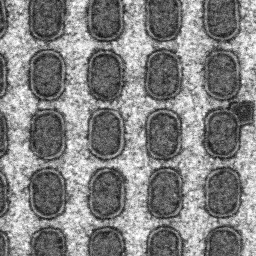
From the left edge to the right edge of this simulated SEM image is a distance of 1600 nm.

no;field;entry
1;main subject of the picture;a regular array of raised bodies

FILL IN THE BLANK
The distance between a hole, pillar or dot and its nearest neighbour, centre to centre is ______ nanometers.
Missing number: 360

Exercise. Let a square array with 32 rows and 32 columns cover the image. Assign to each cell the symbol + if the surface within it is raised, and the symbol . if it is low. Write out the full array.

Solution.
....++++...++++...++++....++++..
+...++++...++++...++++....++++..
+...++++...++++...++++....++++..
+...++++...++++...++++....++++..
.....++.....+++....+++.....++...
................................
....................+...........
....++++...++++....+++....+++...
+...++++...++++....+++....++++..
+...++++...++++...++++....++++..
+...++++...++++...++++....++++..
....++++....+++....+++....+++...
................................
..............................+.
....+++.....+++....+++....+++++.
+...++++...++++....+++....++++..
+...++++...++++....+++....++++..
+...++++...++++...++++....++++..
+...++++...++++...++++....++++..
.....++......+.....+++.....+....
................................
.....++......+......++.....++...
+...++++....+++....++++...++++..
+...++++...++++....++++...++++..
+...++++...++++....++++...++++..
+...++++...++++....++++...++++..
+....++.....+++....+++....+++...
................................
................................
+...++++....+++....+++....++++..
+...++++...++++....+++....++++..
+...++++...++++....+++....++++..